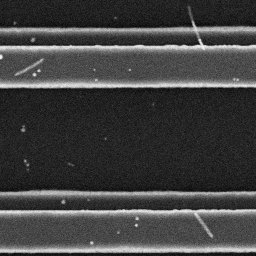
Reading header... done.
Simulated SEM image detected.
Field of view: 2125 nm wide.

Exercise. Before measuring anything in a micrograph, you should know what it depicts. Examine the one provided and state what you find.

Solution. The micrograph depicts lines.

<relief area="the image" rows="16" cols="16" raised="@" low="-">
----------------
----------------
@@@@@@@@@@@@@@@@
@@@@@@@@@@@@@@@@
@@@@@@@@@@@@@@@@
----------------
----------------
----------------
----------------
----------------
----------------
----------------
@@@@@@@@@@@@@@@@
@@@@@@@@@@@@@@@@
@@@@@@@@@@@@@@@@
@@@@@@@@@@@@@@@@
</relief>